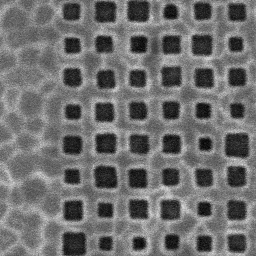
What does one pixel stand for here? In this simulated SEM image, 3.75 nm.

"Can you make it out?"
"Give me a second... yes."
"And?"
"a regular array of holes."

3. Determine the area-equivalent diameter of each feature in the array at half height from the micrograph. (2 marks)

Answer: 78.4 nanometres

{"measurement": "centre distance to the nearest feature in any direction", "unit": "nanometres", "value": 120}